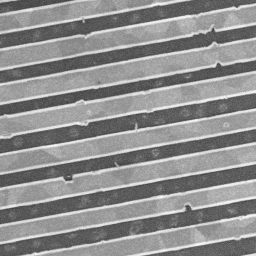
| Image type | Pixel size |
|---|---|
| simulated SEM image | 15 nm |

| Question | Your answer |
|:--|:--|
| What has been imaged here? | parallel lines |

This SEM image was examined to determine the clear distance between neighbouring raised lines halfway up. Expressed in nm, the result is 246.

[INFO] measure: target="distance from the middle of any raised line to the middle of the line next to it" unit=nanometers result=518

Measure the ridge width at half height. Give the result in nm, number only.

275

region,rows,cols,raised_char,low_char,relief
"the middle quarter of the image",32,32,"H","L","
LLLLLLLLLLHHHHHHHHHHHHHHHHHHHHHH
LLLLLHHHHHHHHHHHHHHHHHHHHHHHHHHH
HHHHHHHHHHHHHHHHHHHHHHHHHHLLLLLL
HHHHHHHHHHHHHHHHHHHHLLLLLLLLLLLL
HHHHHHHHHHHHHHHLLLLLLLLLLLLLLLLL
HHHHHHHHHLLLLLLLLLLLLLLLLLLLLHHH
HHHHLLLLLLLLLLLLLLLLLLLHHHHHHHHH
LLLLLLLLLLLLLLLLLLHHHHHHHHHHHHHH
LLLLLLLLLLLLHHHHHHHHHHHHHHHHHHHH
LLLLHLLHHHHHHHHHHHHHHHHHHHHHHHHH
LHHHHHHHHHHHHHHHHHHHHHHHHHHHLLLL
HHHHHHHHHHHHHHHHHHHHHHHLLLLLLLLL
HHHHHHHHHHHHHHHLLLLLLLLLLLLLLLLL
HHHHHHHHHHHLLLLLLLLLLLLLLLLLLLLL
HHHHHHLLLLLLLLLLLLLLLLLLLLLLLLLH
LLLLLLLLLLLLLLLLLLLLLLLLLHHHHHHH
LLLLLLLLLLLLLLLLLLHHHHHHHHHHHHHH
LLLLLLLLLLLLLLHHHHHHHHHHHHHHHHHH
LLLLLLLLHHHHHHHHHHHHHHHHHHHHHHHH
LLLHHHHHHHHHHHHHHHHHHHHHHHHHLLLL
HHHHHHHHHHHHHHHHHHHHHHLLLLLLLLLL
HHHHHHHHHHHHHHHHHLLLLLLLLLLLLLLL
HHHHHHHHHHHLLLLLLLLLLLLLLLLLLLLL
HHHHHHLLLLLLLLLLLLLLLLLLLLLLHHHH
HLLLLLLLLLLLLLLLLLLLLLLHHHHHHHHH
LLLLLLLLLLLLLHLLLHHHHHHHHHHHHHHH
LLLLLLLLLLLHHHHHHHHHHHHHHHHHHHHH
LLLLLLHHHHHHHHHHHHHHHHHHHHHHHHHH
LLHHHHHHHHHHHHHHHHHHHHHHHLLLLLLL
HHHHHHHHHHHHHHHHHHHHHLLLLLLLLLLL
HHHHHHHHHHHHHHHHLLLLLLLLLLLLLLLL
HHHHHHHHHLLLLLLLLLLLLLLLLLLLLLLL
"